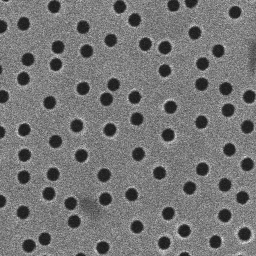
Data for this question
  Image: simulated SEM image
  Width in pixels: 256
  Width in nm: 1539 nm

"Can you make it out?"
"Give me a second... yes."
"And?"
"a regular array of holes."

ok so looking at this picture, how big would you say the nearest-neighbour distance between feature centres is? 141 nm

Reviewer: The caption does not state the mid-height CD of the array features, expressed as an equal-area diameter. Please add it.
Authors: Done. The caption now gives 80.3 nm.